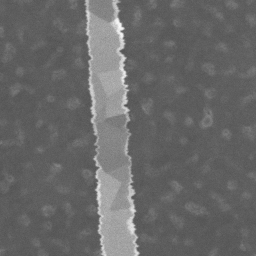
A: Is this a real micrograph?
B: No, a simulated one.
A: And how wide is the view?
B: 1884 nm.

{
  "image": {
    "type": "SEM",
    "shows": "one or a few lines or trenches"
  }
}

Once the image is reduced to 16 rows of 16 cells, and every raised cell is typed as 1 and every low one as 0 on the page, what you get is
0000011000000000
0000011000000000
0000001100000000
0000001100000000
0000001100000000
0000001100000000
0000001100000000
0000001100000000
0000001100000000
0000001100000000
0000001100000000
0000001100000000
0000001100000000
0000001100000000
0000001100000000
0000001110000000